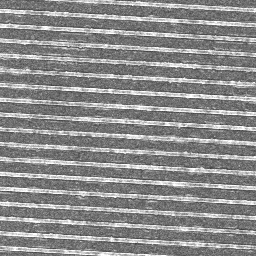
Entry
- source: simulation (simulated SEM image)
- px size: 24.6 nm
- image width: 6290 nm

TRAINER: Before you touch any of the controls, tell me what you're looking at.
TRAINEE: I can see parallel lines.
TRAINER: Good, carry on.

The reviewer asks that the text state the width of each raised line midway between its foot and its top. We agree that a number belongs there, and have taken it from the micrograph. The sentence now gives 0.0828 um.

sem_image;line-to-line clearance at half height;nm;279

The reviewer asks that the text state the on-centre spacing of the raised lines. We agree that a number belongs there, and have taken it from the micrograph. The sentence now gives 364 nanometers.